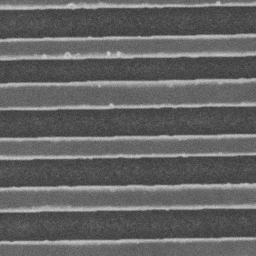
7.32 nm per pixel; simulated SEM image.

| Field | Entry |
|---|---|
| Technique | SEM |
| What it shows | lines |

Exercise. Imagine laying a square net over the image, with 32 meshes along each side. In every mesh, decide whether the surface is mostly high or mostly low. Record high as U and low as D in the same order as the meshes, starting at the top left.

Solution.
UUUUUUUUUUUUUUUUUUUUUUUUUUUUUUUU
DDDDDDDDDDDDDDDDDDDDDDDDDDDDDDDD
DDDDDDDDDDDDDDDDDDDDDDDDDDDDDDDD
DDDDDDDDDDDDDDDDDDDDDDDDDDDDDDDD
DDDDDDDDDDDDDDDDDDDDDDDDDDDUUUUU
UUUUUUUUUUUUUUUUUUUUUUUUUUUUUUUU
UUUUUUUUUUUUUUUUUUUUUUUUUUUUUUUU
DDDDDDDDDDDDDDDDDDDDDDDDDDDDDDDD
DDDDDDDDDDDDDDDDDDDDDDDDDDDDDDDD
DDDDDDDDDDDDDDDDDDDDDDDDDDDDDDDD
DUUUUUUUUUUUUUUUUUUUUUUUUUUUUUUU
UUUUUUUUUUUUUUUUUUUUUUUUUUUUUUUU
UUUUUUUUUUUUUUUUUUUUUUUUUUUUUUUU
UUUUUUUUUUDUUDDDDDDDDDDDDDDDDDDD
DDDDDDDDDDDDDDDDDDDDDDDDDDDDDDDD
DDDDDDDDDDDDDDDDDDDDDDDDDDDDDDDD
DDDDDDDDDDDDDDDDDDDDDDDDDDDDDDDD
UUUUUUUUUUUUUUUUUUUUUUUUUUUUUUUU
UUUUUUUUUUUUUUUUUUUUUUUUUUUUUUUU
UUUUUUUUUUUUUUUUUUUUUUUUDDDDDDDD
DDDDDDDDDDDDDDDDDDDDDDDDDDDDDDDD
DDDDDDDDDDDDDDDDDDDDDDDDDDDDDDDD
DDDDDDDDDDDDDDDDDDDDDDDDDDDDDDDD
DDDDUUUUUUUUUUUUUUUUUUUUUUUUUUUU
UUUUUUUUUUUUUUUUUUUUUUUUUUUUUUUU
UUUUUUUUUUUUUUUUUUUUUUUUUUUUUUUU
DDDDDDDDDDDDDDDDDDDDDDDDDDDDDDDD
DDDDDDDDDDDDDDDDDDDDDDDDDDDDDDDD
DDDDDDDDDDDDDDDDDDDDDDDDDDDDDDDD
DDDDDDDDDDDDDDDDDDDDDDDDDDDDDDDD
UUUUUUUUUUUUUUUUUUUUUUUUUUUUUUUU
UUUUUUUUUUUUUUUUUUUUUUUUUUUUUUUU